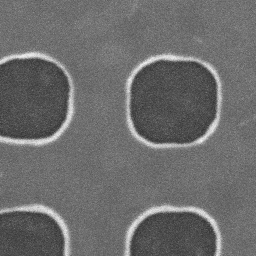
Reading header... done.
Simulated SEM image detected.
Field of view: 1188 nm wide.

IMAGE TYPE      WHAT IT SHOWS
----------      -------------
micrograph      holes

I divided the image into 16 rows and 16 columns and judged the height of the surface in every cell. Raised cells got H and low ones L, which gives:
HHHHHHHHHHHHHHHH
HHHHHHHHHHHHHHHH
HHHHHHHHHHHHHHHH
HHHHHHHHHHHHHHHH
LLLLHHHHHLLLLHHH
LLLLHHHHLLLLLLHH
LLLLHHHHLLLLLLHH
LLLLHHHHLLLLLHHH
LLLHHHHHHLLLLHHH
HHHHHHHHHHHHHHHH
HHHHHHHHHHHHHHHH
HHHHHHHHHHHHHHHH
HHHHHHHHHHHHHHHH
LLLHHHHHHLLLLHHH
LLLLHHHHLLLLLHHH
LLLLHHHHLLLLLLHH